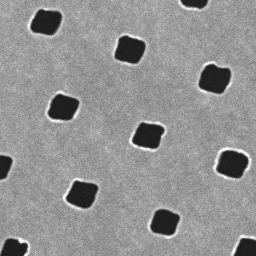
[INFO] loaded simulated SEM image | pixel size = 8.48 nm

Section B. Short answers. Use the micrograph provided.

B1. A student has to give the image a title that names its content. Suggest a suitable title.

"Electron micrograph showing a regular array of holes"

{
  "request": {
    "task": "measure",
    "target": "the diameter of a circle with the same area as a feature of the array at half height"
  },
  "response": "241 nm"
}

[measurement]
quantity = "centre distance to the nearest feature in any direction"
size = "738 nm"